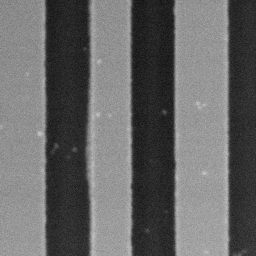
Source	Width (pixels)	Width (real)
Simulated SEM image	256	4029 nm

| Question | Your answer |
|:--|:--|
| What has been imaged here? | lines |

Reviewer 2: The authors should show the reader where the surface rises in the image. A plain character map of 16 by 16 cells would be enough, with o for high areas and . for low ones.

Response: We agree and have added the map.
ooo...oo...ooo..
ooo...oo...ooo..
ooo...oo...ooo..
ooo...oo...ooo..
ooo...oo...ooo..
ooo...oo...ooo..
ooo...oo...ooo..
ooo...oo...ooo..
ooo...oo...ooo..
ooo...oo...ooo..
ooo...oo...ooo..
ooo...oo...ooo..
ooo...oo...ooo..
ooo...oo...ooo..
ooo...oo...ooo..
ooo...oo...ooo..